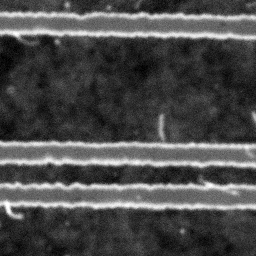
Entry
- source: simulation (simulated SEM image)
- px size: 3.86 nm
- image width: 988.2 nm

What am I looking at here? lines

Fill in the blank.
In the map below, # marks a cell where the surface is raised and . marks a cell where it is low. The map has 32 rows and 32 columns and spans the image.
................................
................................
################################
################################
...............##..#############
................................
................................
................................
................................
................................
................................
................................
................................
................................
................................
................................
................................
................................
################################
################################
...................#############
................................
................................
################################
################################
################################
................................
................................
................................
................................
................................
................................